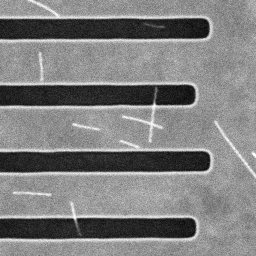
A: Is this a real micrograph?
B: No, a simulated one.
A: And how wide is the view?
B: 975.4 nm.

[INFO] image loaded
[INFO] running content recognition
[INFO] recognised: groups of lines, slits or small figures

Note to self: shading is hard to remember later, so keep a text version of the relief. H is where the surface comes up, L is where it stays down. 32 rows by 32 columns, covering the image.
HHHHHHHHHHHHHHHHHHHHHHHHHHHHHHHH
HHHHHHHHHHHHHHHHHHHHHHHHHHHHHHHH
LLLLLLLLLLLLLLLLLLLLLLLLLLHHHHHH
LLLLLLLLLLLLLLLLLLLLLLLLLLHHHHHH
LLLLLLLLLLLLLLLLLLLLLLLLLLHHHHHH
HHHHHHHHHHHHHHHHHHHHHHHHHHHHHHHH
HHHHHHHHHHHHHHHHHHHHHHHHHHHHHHHH
HHHHHHHHHHHHHHHHHHHHHHHHHHHHHHHH
HHHHHHHHHHHHHHHHHHHHHHHHHHHHHHHH
HHHHHHHHHHHHHHHHHHHHHHHHHHHHHHHH
HHHHHHHHHHHHLHHHHHLLLLLHHHHHHHHH
LLLLLLLLLLLLLLLLLLLLLLLLHHHHHHHH
LLLLLLLLLLLLLLLLLLLLLLLLHHHHHHHH
HHHHHHHHHHHHHHHHHHHHHHHHHHHHHHHH
HHHHHHHHHHHHHHHHHHHHHHHHHHHHHHHH
HHHHHHHHHHHHHHHHHHHHHHHHHHHHHHHH
HHHHHHHHHHHHHHHHHHHHHHHHHHHHHHHH
HHHHHHHHHHHHHHHHHHHHHHHHHHHHHHHH
HHHHHHHHHHHHHHHHHHHHHHHHHHHHHHHH
LLLLLLLLLLLLLLLLLLLLLLLLLLHHHHHH
LLLLLLLLLLLLLLLLLLLLLLLLLLHHHHHH
LLLLLLLLLLLLLLLLLLLLLLLLLHHHHHHH
HHHHHHHHHHHHHHHHHHHHHHHHHHHHHHHH
HHHHHHHHHHHHHHHHHHHHHHHHHHHHHHHH
HHHHHHHHHHHHHHHHHHHHHHHHHHHHHHHH
HHHHHHHHHHHHHHHHHHHHHHHHHHHHHHHH
HHHHHHHHHHHHHHHHHHHHHHHHHHHHHHHH
LLLLLLLLLLLLLLLLLLLLLLLLHHHHHHHH
LLLLLLLLLLLLLLLLLLLLLLLLLHHHHHHH
LLLLLLLLLLLLLLLLLLLLLLLLHHHHHHHH
HHHHHHHHHHHHHHHHHHHHHHHHHHHHHHHH
HHHHHHHHHHHHHHHHHHHHHHHHHHHHHHHH